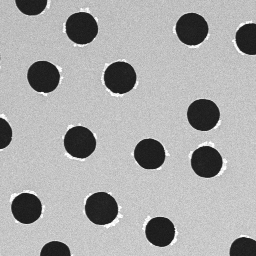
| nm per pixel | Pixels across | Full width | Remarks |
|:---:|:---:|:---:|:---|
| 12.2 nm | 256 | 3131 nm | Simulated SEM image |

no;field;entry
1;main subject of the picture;a regular array of holes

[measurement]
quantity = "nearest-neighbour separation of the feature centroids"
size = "767 nm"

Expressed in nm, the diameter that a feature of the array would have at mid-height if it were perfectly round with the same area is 398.